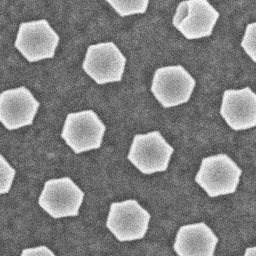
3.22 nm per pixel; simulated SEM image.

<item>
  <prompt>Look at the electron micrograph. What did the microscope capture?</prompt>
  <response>a regular array of raised bodies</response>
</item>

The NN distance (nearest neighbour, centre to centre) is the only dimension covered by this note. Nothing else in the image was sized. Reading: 228 nanometres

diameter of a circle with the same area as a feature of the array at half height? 131 nanometers